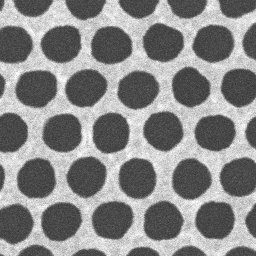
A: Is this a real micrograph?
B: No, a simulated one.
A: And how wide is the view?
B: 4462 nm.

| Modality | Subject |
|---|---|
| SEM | a regular array of holes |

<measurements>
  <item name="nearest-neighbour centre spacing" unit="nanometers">859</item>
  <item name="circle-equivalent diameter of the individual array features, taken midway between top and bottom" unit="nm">699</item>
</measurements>